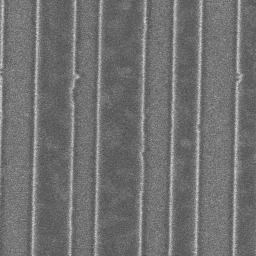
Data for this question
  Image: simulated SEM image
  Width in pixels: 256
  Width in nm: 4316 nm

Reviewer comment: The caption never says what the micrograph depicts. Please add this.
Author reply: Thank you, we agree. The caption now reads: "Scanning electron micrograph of one or a few lines or trenches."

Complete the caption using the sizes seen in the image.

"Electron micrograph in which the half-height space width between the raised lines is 506 nanometers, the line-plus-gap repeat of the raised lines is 65.8 pixels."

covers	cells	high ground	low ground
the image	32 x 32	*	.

.....****....*****....***.....**
.....****....*****....***.....**
.....****....*****....***.....**
.....****....*****....***.....**
.....****....*****....***.....**
.....****....*****....***.....**
.....****....*****....***.....**
.....****...******....***.....**
.....****...******....***.....**
.....****...******....***.....**
....*****...******....***.....**
....*****...******....***.....**
....*****...******....***.....**
.....****...******....***.....**
.....****...******....***.....**
....*****...******....***.....**
....*****...******....***.....**
....*****...******....***....***
....*****...******....***....***
....*****...******....***....***
....*****...******...****....***
....*****...******...****....***
....*****...******...****....***
....*****...******...****....***
....*****...******...****....***
....*****...******...****....***
....*****...******...****....***
....*****...******...****....***
....*****...******...****....***
....*****...******...***.....***
....*****...******...***.....***
....*****...******...***.....***